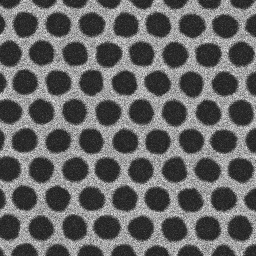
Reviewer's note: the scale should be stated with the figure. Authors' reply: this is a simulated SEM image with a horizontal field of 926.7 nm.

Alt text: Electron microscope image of a regular array of holes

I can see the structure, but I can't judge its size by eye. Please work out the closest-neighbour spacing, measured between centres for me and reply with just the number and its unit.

119 nm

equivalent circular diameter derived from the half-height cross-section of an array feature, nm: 93.1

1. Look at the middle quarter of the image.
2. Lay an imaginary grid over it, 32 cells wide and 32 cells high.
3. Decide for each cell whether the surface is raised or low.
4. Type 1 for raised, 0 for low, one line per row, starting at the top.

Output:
11001111100011111100011111000111
11111100111111101111111111111111
01111000011110000011100001111100
00110000001100000011000000111000
00110000001100000011000000011000
00110000001100000001000000011000
01110000001100000011100000111000
11111000111110000111110001111100
11111111111111111111111111111111
00000111100001111000011111000111
00000111000000111000001110000011
00000011000000110000001110000001
00000011000000110000000100000001
00000111000000110000001110000001
10000111100001111000001111000011
11111111111111111111111111100111
11111000011111001111110001111100
01110000011110000011100000111000
00110000001100000001000000110000
00110000001100000001000000011000
01110000001100000011000000111000
01110000011110000011100000111100
11111100111111101111111001111110
10000111100111111110111111100111
00000011000000111000001110000011
00000011000000110000001110000011
00000011000000110000000100000001
00000011000000110000001100000001
00000011000000111000001110000011
11001111110011111000011111100111
11111111111111101111111111111111
01111000011110000111100001111100